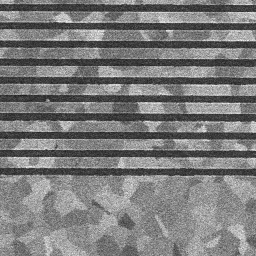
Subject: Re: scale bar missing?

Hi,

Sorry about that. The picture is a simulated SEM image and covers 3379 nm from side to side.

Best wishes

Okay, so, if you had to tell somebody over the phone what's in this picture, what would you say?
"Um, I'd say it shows parallel lines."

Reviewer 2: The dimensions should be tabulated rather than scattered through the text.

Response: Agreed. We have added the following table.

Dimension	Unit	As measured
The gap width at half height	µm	0.104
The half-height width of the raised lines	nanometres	130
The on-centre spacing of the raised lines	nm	240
